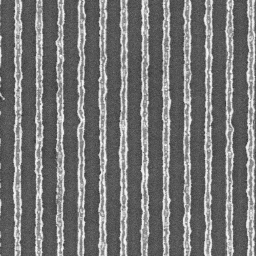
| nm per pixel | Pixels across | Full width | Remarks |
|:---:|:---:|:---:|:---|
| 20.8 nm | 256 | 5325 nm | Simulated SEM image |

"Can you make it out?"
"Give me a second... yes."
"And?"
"parallel lines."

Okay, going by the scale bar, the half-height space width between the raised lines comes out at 346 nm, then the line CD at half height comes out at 0.109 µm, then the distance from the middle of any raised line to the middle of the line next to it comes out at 440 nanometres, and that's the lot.